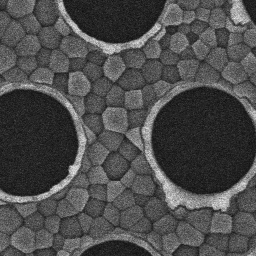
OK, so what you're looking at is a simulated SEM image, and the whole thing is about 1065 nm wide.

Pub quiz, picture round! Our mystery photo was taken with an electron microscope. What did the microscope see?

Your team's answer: holes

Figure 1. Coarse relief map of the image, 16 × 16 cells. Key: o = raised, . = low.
oooo......ooooo.
ooooo.....oooooo
oooooo..oooooooo
oooooooooooooooo
oooooooooooooooo
oooooooooooo..oo
....oooooo.....o
.....ooooo......
.....oooo.......
.....ooooo......
....oooooo......
....ooooooo....o
oooooooooooooooo
oooooooooooooooo
oooooooooooooooo
oooooo...ooooooo